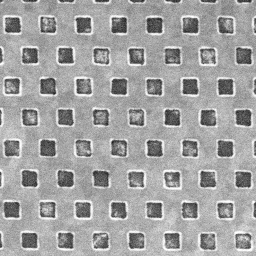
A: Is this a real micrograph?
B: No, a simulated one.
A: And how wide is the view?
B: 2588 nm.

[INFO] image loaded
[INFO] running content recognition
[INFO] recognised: a regular array of holes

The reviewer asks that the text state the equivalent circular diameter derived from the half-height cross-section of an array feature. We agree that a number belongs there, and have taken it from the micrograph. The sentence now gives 18.7 pixels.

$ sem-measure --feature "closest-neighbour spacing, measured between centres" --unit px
35.2